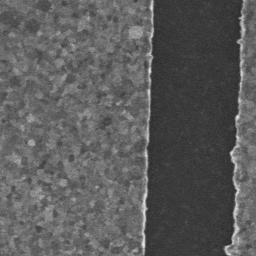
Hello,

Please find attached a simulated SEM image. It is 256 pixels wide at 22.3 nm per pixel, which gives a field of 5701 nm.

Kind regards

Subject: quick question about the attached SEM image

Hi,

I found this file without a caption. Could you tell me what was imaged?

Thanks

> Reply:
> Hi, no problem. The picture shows one or a few lines or trenches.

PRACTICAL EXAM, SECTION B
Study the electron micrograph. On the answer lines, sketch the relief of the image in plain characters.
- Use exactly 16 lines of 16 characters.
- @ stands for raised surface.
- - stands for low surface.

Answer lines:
@@@@@@@@@@-----@
@@@@@@@@@@-----@
@@@@@@@@@------@
@@@@@@@@@------@
@@@@@@@@@------@
@@@@@@@@@------@
@@@@@@@@@------@
@@@@@@@@@------@
@@@@@@@@@------@
@@@@@@@@@------@
@@@@@@@@@------@
@@@@@@@@@------@
@@@@@@@@@------@
@@@@@@@@@------@
@@@@@@@@@------@
@@@@@@@@@-----@@